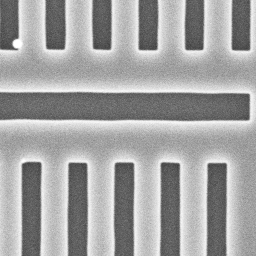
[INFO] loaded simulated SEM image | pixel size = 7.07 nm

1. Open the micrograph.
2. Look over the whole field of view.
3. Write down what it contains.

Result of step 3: groups of lines, slits or small figures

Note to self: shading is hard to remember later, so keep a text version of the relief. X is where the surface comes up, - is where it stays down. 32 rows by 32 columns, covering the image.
--XXXX--XXX---XXX---XXX---XXX--X
--XXXX--XXX---XXX---XXX---XXX--X
--XXXX--XXX---XXX---XXX---XXX--X
---XXX--XXX---XXX---XXX---XXX--X
---XXX--XXXX--XXX---XXX---XXX--X
--XXXX--XXXX--XXX---XXX---XXX--X
XXXXXXXXXXXXXXXXXXXXXXXXXXXXXXXX
XXXXXXXXXXXXXXXXXXXXXXXXXXXXXXXX
XXXXXXXXXXXXXXXXXXXXXXXXXXXXXXXX
XXXXXXXXXXXXXXXXXXXXXXXXXXXXXXXX
XXXXXXXXXXXXXXXXXXXXXXXXXXXXXXXX
-------------XXX-XXX---XXXXXXXXX
-------------------------------X
-------------------------------X
-------------------------------X
XXXXXXXXXXXXXXXXXXXXXXXXXXXXXXXX
XXXXXXXXXXXXXXXXXXXXXXXXXXXXXXXX
XXXXXXXXXXXXXXXXXXXXXXXXXXXXXXXX
XXXXXXXXXXXXXXXXXXXXXXXXXXXXXXXX
XXXXXXXXXXXXXXXXXXXXXXXXXXXXXXXX
XXX--XXXX--XXX---XXX--XXXX--XXXX
XXX--XXX---XXX---XXX---XXX--XXXX
XXX--XXX---XXX---XXX---XXX--XXXX
XXX--XXX---XXX---XXX---XXX--XXXX
XXX--XXX---XXX---XXX---XXX--XXXX
XXX--XXX---XXX---XXX---XXX--XXXX
XXX--XXX---XXX---XXX---XXX--XXXX
XXX--XXX---XXX---XXX---XXX--XXXX
XXX--XXX---XXX---XXX---XXX--XXXX
XXX--XXX---XXX---XXX---XXX--XXXX
XXX--XXX---XXX---XXX---XXX--XXXX
XXX--XXX---XXX---XXX---XXX--XXXX